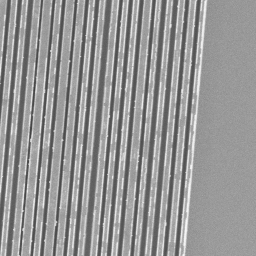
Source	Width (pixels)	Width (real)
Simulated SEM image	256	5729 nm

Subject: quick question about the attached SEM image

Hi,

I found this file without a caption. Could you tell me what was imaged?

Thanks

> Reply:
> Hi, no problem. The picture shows parallel lines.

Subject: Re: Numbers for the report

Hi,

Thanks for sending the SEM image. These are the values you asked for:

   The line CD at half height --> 137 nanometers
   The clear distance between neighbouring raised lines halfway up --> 97.6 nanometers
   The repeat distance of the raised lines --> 248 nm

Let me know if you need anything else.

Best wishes